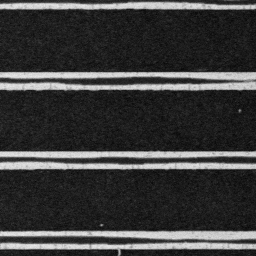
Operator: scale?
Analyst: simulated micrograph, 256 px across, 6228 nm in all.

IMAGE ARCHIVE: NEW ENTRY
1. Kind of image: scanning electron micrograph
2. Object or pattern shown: lines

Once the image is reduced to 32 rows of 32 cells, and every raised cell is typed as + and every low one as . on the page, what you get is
++++++++++++++++++++++++++++++++
................................
................................
................................
................................
................................
................................
................................
................................
++++++++++++++++++++++++++++++.+
++++++++++++++++++++++++++++++++
................................
................................
................................
................................
................................
................................
................................
................................
++++++++++++++++++++++++++++++++
++++++++++++++++++++++++++++++++
................................
................................
................................
................................
................................
................................
................................
................................
+++++++++++++++++++++++++++.++++
++++++++++++++++++++++++++++++++
................................